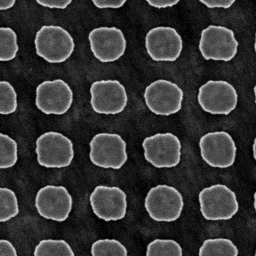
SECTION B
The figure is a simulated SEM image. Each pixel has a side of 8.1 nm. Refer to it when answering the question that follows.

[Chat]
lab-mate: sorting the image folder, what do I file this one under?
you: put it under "a regular array of raised bodies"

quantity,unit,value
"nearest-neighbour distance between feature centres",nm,429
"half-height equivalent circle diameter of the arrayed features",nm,295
